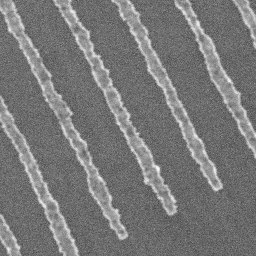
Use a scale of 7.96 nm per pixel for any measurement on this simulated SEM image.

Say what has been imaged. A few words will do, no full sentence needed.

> parallel lines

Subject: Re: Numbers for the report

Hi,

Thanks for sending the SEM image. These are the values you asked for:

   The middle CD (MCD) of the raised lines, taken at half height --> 0.0902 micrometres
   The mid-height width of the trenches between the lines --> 330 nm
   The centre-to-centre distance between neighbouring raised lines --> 417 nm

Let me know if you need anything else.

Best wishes